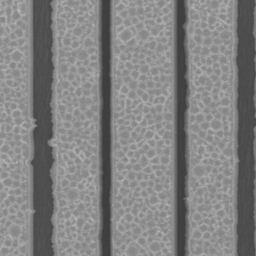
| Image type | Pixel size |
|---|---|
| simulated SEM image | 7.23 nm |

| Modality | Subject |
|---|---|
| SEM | one or a few lines or trenches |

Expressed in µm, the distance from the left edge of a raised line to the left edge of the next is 0.485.